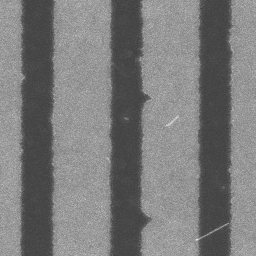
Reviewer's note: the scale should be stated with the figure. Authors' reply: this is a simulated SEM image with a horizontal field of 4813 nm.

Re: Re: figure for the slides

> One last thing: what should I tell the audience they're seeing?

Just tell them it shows one or a few lines or trenches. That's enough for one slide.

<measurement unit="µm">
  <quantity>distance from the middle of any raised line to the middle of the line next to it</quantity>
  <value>1.67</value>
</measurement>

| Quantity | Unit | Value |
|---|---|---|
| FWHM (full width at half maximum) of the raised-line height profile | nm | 618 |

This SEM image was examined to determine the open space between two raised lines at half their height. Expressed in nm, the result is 1050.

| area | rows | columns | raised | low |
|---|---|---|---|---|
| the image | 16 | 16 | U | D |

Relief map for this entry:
DUUDDDDUUDDDUUUD
DUUDDDDUUDDDUUUD
DUUDDDDUUDDDUUDD
DUUDDDDUUDDDUUUD
DUUDDDDUUDDDUUUD
DUUDDDDUUDDDUUDD
DUUDDDDUUDDDUUUD
DUUDDDDUUDDDUUDD
DUUDDDDUUDDDUUDD
DUUDDDDUUDDDUUDD
DUUDDDDUUDDDUUDD
DUUDDDDUUDDDUUDD
DUUDDDDUUDDDUUUD
DUUDDDDUUDDDUUUD
DUUDDDDUUDDDUUDD
DUUDDDDUUDDDUUDD